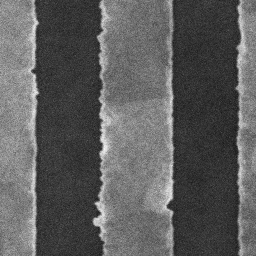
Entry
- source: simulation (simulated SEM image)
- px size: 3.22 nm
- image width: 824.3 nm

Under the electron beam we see one or a few lines or trenches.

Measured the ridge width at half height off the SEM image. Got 224 nanometers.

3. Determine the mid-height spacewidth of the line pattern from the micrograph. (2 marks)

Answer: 218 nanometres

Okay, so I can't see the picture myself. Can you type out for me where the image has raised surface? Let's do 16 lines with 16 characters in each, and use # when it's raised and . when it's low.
##....#####....#
##....#####....#
##....#####....#
##....#####....#
##....#####....#
##....#####....#
##....#####....#
##....#####....#
##....#####....#
##....#####....#
##....#####....#
##....#####....#
##....#####....#
##....#####....#
##....#####....#
##....#####....#